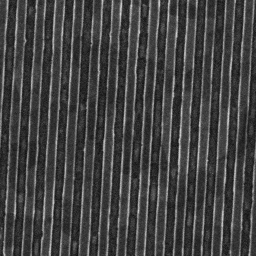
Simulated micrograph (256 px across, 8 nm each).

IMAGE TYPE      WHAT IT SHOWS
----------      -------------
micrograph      parallel lines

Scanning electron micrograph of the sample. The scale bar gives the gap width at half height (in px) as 9.47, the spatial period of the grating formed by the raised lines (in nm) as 151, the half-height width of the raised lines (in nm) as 75.8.